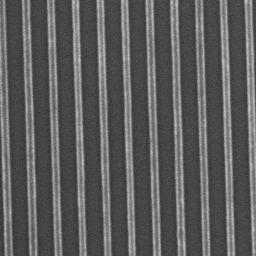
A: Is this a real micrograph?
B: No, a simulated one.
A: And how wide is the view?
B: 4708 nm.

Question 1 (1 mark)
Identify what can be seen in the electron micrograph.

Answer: parallel lines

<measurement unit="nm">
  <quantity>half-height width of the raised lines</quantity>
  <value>103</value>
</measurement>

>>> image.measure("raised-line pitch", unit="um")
0.454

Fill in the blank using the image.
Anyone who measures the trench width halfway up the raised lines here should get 342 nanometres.